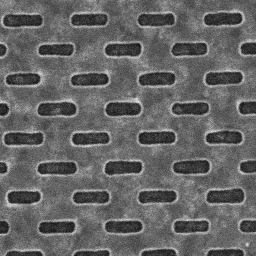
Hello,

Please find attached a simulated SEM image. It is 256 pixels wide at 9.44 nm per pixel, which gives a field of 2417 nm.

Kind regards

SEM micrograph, a regular array of holes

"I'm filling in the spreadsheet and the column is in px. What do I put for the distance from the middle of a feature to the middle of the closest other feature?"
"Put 44.2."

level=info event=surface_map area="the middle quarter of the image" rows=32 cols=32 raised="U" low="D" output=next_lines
UUUUUUUUUUDDDUUUUDUUUUUUUUUUUUUU
UUUUUUUUUUDDDUUUUUUUUUUUUUUUUUUU
UUUDDDDDDDDUUUUUUUUDDDDDDDDDUUUU
UUDDDDDDDDDUUUUUUUUDDDDDDDDDUUUU
UUDDDDDDDDDUUUUUUUUDDDDDDDDDUUUU
UUUDDDDDDDUUUUUUUUUUDDDDDDDUUUUU
UUUUUUUUUUUUUUUUUDDUUUUUUUUUUUUU
UUUUUUUUUUUUUUUUDDDUUUUUUUUUUUUU
UUUUUUUUUUUUUUUUDDDUUUUUUUUUUUUU
DDUUUUUUUUUDDDDDDDUUUUUUUUUUUUUD
DDDUUUUUUUDDDDDDDDDUUUUUUUUDDDDD
DDDUUUUUUUDDDDDDDDDUUUUUUUUDDDDD
DDDUUUUUUUUDDDDDDDDUUUUUUUUDDDDD
UUUUUUUUUUUUUUUUUUUUUUUUUUUUUUUU
UUUUUUUUUUUUUUUUUUUUUUUUUUUUUUUU
UUUUUUUUUUUUUUUUUUUUUUUUUUUUUUUU
UUUUUUUUUUUUUUUUUUUUUUUUUDDUUUUU
UUDDDDDDDDDUUUUUDUDDDDDDDDDDUUUU
UUDDDDDDDDDDUUUUUUDDDDDDDDDDUUUU
UUDDDDDDDDDUUUUUUUUDDDDDDDDDUUUU
UUUDDDDUUUUUUUUUUUUUUUUUUUUUUUUU
UUUUUUUUUUUUUUUUUUUUUUUUUUUUUUUU
UUUUUUUUUUUUUUUUUUUUUUUUUUUUUUUU
UUUUUUUUDUUUUUUUUUUUUUUUUUUUUUUU
DDDUUUUDUUUDDDDDDDDUUUUUUUUUDDDD
DDDUUUUUUUDDDDDDDDDDUUUUUUUDDDDD
DDDUUUUUUUDDDDDDDDDUUUUUUUUDDDDD
DDUUUUUUUUUDDDDDDDDUUUUUUUUUDDDD
UUUUUUUUUUUDDUUUUUUUUUUUUUUUUUUU
UUUUUUUUUUUUUUUUUUUUUUUUUUUUUUUU
UUUUUUUUUUUUUUUUUUUUUUUUUUUUUUUU
UUUUUUUUUUUUUUUUUUUUDDDDDDDUUUUU